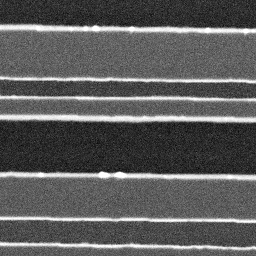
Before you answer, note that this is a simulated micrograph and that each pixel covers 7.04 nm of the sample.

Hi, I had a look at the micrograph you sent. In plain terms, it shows lines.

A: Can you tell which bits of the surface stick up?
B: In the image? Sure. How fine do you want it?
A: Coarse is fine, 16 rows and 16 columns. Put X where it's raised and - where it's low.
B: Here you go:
----------------
----------------
XXXXXXXXXXXXXXXX
XXXXXXXXXXXXXXXX
XXXXXXXXXXXXXXXX
XXXXXXXXXXXXXXXX
XXXXXXXXXXXXXXXX
----------------
----------------
----------------
----------------
XXXXXXXXXXXXXXXX
XXXXXXXXXXXXXXXX
XXXXXXXXXXXXXXXX
XXXXXXXXXXXXXXXX
XXXXXXXXXXXXXXXX